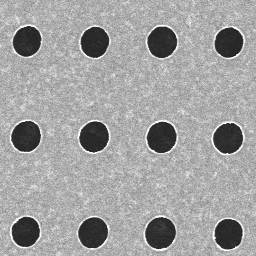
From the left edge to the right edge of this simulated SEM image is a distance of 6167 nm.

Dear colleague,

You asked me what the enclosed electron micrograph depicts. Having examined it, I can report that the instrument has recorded a regular array of holes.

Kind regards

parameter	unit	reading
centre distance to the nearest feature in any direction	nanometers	1620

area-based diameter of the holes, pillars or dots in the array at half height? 732 nm